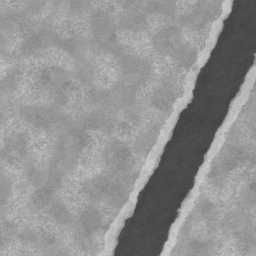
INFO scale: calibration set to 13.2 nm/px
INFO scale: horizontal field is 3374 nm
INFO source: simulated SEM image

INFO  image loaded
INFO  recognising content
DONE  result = one or a few lines or trenches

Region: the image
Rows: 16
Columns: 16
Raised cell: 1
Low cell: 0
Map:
1111111111111100
1111111111111100
1111111111111000
1111111111111000
1111111111110000
1111111111110001
1111111111100001
1111111111100011
1111111111000011
1111111111000111
1111111110000111
1111111110001111
1111111100001111
1111111100011111
1111111000011111
1111111000011111